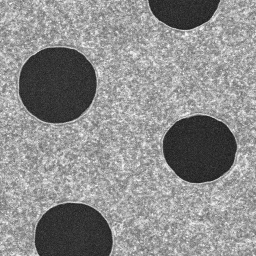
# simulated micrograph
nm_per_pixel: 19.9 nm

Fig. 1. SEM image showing holes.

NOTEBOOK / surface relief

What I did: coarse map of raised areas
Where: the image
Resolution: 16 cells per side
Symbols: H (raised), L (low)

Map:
HHHHHHHHHLLLLLHH
HHHHHHHHHHLLLHHH
HHHHHHHHHHHHHHHH
HHLLLHHHHHHHHHHH
HLLLLLHHHHHHHHHH
HLLLLLHHHHHHHHHH
HLLLLLHHHHHHHHHH
HHHLLHHHHHHLLLHH
HHHHHHHHHHLLLLLH
HHHHHHHHHHLLLLLH
HHHHHHHHHHHLLLHH
HHHHHHHHHHHHHHHH
HHHHHHHHHHHHHHHH
HHHLLLHHHHHHHHHH
HHLLLLLHHHHHHHHH
HHLLLLLHHHHHHHHH